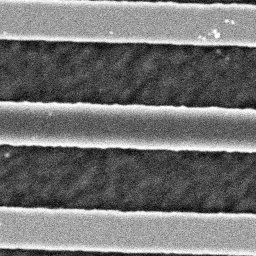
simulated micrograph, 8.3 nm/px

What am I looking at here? lines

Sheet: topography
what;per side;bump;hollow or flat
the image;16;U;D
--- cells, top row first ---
UUUUUUUUUUUUUUUU
UUUUUUUUUUUUUUUU
DDDUUUUUUUUUUUUU
DDDDDDDDDDDDDDDD
DDDDDDDDDDDDDDDD
DDDDDDDDDDDDDDDD
UUUUUUDDDDDDDDDD
UUUUUUUUUUUUUUUU
UUUUUUUUUUUUUUUU
DDDDDDDDDDDDDDDD
DDDDDDDDDDDDDDDD
DDDDDDDDDDDDDDDD
DDDDDDDDDDDDDDDD
UUUUUUUUUUUUUUUU
UUUUUUUUUUUUUUUU
DDUUUUUUUUUUUUUU